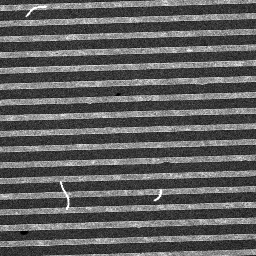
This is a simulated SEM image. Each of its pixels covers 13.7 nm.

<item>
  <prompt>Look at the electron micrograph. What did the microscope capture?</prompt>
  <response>parallel lines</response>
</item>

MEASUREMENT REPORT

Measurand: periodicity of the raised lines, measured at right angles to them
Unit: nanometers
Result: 215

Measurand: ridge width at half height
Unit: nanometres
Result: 78.7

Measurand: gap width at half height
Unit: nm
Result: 137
